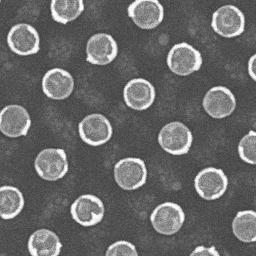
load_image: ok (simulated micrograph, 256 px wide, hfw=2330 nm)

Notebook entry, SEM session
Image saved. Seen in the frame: a regular array of raised bodies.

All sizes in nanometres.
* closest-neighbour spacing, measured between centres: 507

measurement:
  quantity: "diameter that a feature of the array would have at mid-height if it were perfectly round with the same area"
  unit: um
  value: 0.289